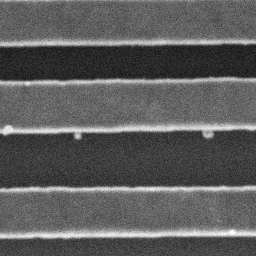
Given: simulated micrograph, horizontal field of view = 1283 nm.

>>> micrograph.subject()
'lines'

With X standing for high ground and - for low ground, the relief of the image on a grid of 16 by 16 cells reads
XXXXXXXXXXXXXXXX
XXXXXXXXXXXXXXXX
XXXXXXXXXXXXXXXX
----------------
----------------
XXXXXXXXXXXXXXXX
XXXXXXXXXXXXXXXX
XXXXXXXXXXXXXXXX
----------------
----------------
----------------
----------------
XXXXXXXXXXXXXXXX
XXXXXXXXXXXXXXXX
XXXXXXXXXXXXXXXX
----------------